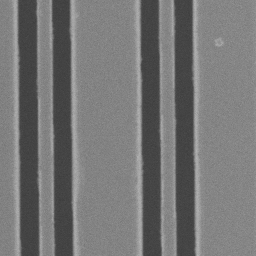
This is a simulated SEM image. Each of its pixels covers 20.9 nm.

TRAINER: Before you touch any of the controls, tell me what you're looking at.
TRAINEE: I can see lines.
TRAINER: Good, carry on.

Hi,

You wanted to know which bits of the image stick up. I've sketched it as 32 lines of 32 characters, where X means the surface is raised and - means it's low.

XX---X---XXXXXXXX---XX--XXXXXXXX
XX---X---XXXXXXXXX--XX--XXXXXXXX
XX---X---XXXXXXXXX--XX--XXXXXXXX
XX---X---XXXXXXXXX--XX--XXXXXXXX
XX---X---XXXXXXXXX--XX--XXXXXXXX
XX---X---XXXXXXXXX--XX--XXXXXXXX
XX---X---XXXXXXXXX--XX--XXXXXXXX
XX---XX--XXXXXXXXX--XX--XXXXXXXX
XX---XX--XXXXXXXXX--XX--XXXXXXXX
XX---XX--XXXXXXXXX--XX--XXXXXXXX
XX---XX--XXXXXXXXX--XX--XXXXXXXX
XX---XX--XXXXXXXXX--XX--XXXXXXXX
XX---XX--XXXXXXXXX--XX--XXXXXXXX
XX---XX--XXXXXXXXX--XX--XXXXXXXX
XX---XX--XXXXXXXXX--XX--XXXXXXXX
XX---XX--XXXXXXXXX--XX--XXXXXXXX
XX---XX--XXXXXXXXX--XX--XXXXXXXX
XX---XX--XXXXXXXXX--XX--XXXXXXXX
XX---XX--XXXXXXXXX--XX--XXXXXXXX
XX---XX--XXXXXXXXX--XX--XXXXXXXX
XX---XX--XXXXXXXXX--XX--XXXXXXXX
XX---XX--XXXXXXXXX--XX--XXXXXXXX
XX---XX--XXXXXXXXX--XX--XXXXXXXX
XX---XX--XXXXXXXXX--XX--XXXXXXXX
XX---XX--XXXXXXXXX--XX--XXXXXXXX
XX---XX--XXXXXXXXX--XX--XXXXXXXX
XX---XX--XXXXXXXXX--XX--XXXXXXXX
XX---XX--XXXXXXXXX--XX---XXXXXXX
XX---XX--XXXXXXXXX--XX---XXXXXXX
XX---XX--XXXXXXXXX--XX---XXXXXXX
XX---XX--XXXXXXXXX--XX---XXXXXXX
XX---XX--XXXXXXXXX--XX---XXXXXXX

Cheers